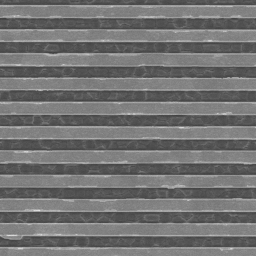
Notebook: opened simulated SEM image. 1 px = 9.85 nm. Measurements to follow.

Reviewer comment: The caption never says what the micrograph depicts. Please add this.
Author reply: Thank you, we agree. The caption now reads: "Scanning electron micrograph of parallel lines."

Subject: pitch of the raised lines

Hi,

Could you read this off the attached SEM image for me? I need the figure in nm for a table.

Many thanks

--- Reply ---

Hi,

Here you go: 239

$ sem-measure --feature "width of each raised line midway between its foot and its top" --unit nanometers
121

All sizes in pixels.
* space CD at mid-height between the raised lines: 12.1